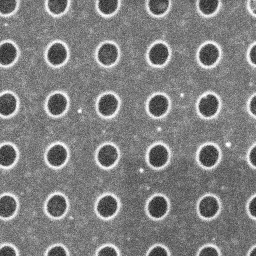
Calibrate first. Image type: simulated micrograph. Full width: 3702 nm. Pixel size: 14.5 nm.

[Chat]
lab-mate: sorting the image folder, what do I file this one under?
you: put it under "a regular array of holes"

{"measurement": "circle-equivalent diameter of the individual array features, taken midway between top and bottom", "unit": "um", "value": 0.319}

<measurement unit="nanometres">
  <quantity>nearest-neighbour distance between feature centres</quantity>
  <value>729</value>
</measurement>